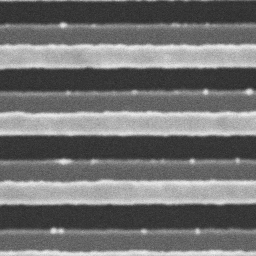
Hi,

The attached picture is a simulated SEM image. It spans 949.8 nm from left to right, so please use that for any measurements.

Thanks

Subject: lines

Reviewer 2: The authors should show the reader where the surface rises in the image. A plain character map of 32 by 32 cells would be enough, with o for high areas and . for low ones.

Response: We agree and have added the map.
................................
................................
................................
oooooooooooooooooooooooooooooooo
oooooooooooooooooooooooooooooooo
oooooooooooooooooooooooooooooooo
oooooooooooooooooooooooooooooooo
oooooooooooooooooooooooooooooooo
o...............................
................................
................................
................oo....o..o...ooo
oooooooooooooooooooooooooooooooo
oooooooooooooooooooooooooooooooo
oooooooooooooooooooooooooooooooo
oooooooooooooooooooooooooooooooo
oooooooooooooooooooooooooooooooo
................................
................................
................................
oooooooooooooooooooooooooooooooo
oooooooooooooooooooooooooooooooo
oooooooooooooooooooooooooooooooo
oooooooooooooooooooooooooooooooo
oooooooooooooooooooooooooooooooo
oooooooo.oooooooo.o.ooo..o.o....
................................
................................
................................
oooooooooooooooooooooooooooooooo
oooooooooooooooooooooooooooooooo
oooooooooooooooooooooooooooooooo